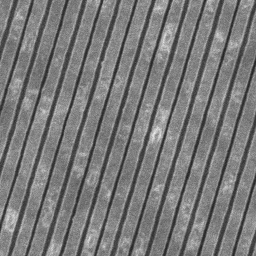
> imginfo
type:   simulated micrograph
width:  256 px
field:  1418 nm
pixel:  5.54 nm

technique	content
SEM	parallel lines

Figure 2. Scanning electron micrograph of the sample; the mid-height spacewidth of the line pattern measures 0.0246 microns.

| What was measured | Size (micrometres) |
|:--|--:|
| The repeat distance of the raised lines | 0.0914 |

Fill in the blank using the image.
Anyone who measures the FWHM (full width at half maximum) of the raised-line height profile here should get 0.0691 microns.